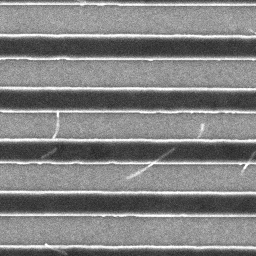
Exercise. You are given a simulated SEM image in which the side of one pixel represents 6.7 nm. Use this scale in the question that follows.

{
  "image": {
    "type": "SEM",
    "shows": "lines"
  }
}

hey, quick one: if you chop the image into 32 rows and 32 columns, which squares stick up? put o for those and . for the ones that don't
oooooooooooooooooooooooooooooooo
................................
................................
................................
ooooooooooooooooooooooooo.......
oooooooooooooooooooooooooooooooo
oooooooooooooooooooooooooooooooo
................................
................................
................................
................................
oooooooooooooooooooooooooooooooo
oooooooooooooooooooooooooooooooo
oooooooooooooooooooooooooooooooo
................................
................................
................................
ooooooooooooooooooo....oo.......
oooooooooooooooooooooooooooooooo
oooooooooooooooooooooooooooooooo
..................oo.........ooo
................................
................................
................................
oooooooooooooooooooooooooooooooo
oooooooooooooooooooooooooooooooo
oooooooooooooooooooooooooooooooo
................................
................................
................................
................................
oooooooooooooooooooooooooooooooo